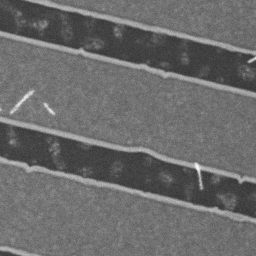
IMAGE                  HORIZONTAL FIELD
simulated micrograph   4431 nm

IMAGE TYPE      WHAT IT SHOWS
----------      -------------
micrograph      one or a few lines or trenches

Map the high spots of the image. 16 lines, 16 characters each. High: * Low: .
....************
........********
**...........***
******..........
**********......
**************..
****************
****************
....************
.........*******
**...........***
******..........
***********.....
***************.
****************
****************